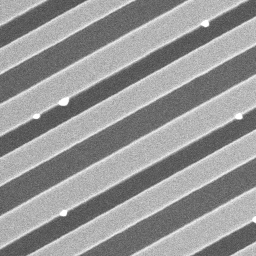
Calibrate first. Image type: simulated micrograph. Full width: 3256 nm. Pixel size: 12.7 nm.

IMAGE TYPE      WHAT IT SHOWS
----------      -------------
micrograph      lines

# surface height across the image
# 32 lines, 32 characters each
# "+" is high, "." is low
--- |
+++++.....++++++.......+++++++..
+++.....++++++.......+++++++....
+......+++++.......+++++++.....+
.....+++++.......+++++++.....+++
...++++++.......+++++++.....++++
.++++++.......+++++++.....++++++
+++++.......+++++++.....++++++..
+++.......+++++++.....++++++....
+.......+++++++.....+++++++.....
.......+++++++.....++++++.......
.....+++++++.....++++++.......++
...+++++++.....++++++.......++++
.++++++++....++++++.......++++++
++++++.....+++++++.......+++++++
+++++.....++++++.......+++++++..
+++.....++++++.......+++++++....
+.....++++++.......+++++++.....+
....++++++.......+++++++......++
..+++++++.......+++++++.....++++
+++++++.......+++++++.....++++++
+++++.......+++++++.....++++++..
+++.......+++++++.....+++++++...
+.......+++++++......++++++.....
.......+++++++.....++++++.......
.....+++++++.....++++++.......++
...+++++++.....++++++.......++++
.+++++++.....+++++++......++++++
++++++......++++++.......+++++++
++++......++++++.......+++++++..
+++.....++++++.......+++++++....
+.....++++++.......+++++++......
....+++++++......++++++++.....++